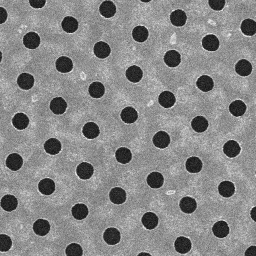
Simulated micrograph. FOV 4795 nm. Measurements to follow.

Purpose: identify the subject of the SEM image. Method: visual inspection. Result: a regular array of holes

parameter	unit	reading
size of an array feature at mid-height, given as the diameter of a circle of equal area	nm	328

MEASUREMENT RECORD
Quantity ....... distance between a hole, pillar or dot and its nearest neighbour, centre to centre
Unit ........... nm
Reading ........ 758